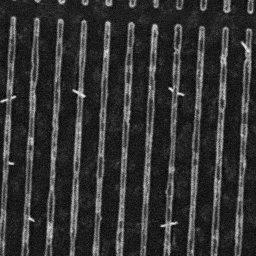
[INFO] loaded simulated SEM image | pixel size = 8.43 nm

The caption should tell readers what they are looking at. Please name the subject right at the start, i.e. parallel lines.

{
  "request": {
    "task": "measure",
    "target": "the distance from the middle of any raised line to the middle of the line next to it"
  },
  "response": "199 nm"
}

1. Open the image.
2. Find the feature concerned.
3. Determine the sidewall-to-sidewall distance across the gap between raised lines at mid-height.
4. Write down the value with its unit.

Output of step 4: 0.156 µm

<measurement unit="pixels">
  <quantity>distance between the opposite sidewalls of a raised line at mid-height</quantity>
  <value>4.86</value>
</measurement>